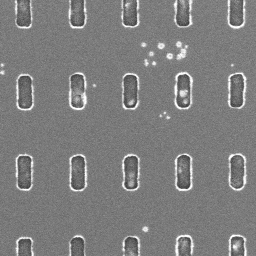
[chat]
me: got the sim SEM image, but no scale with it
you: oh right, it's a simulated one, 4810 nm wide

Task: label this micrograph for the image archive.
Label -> a regular array of holes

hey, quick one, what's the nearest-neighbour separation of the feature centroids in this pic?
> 994 nanometers